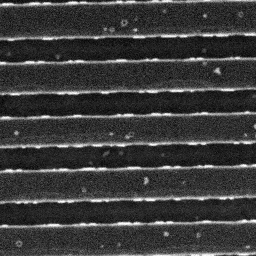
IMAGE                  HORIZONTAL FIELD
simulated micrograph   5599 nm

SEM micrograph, lines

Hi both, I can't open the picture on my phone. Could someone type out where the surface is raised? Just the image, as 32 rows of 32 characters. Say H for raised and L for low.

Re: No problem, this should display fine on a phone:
LLLLLLLLLHHHHHHHHHHHHHHHHHHHHHHH
HHHHHHHHHHHHHHHHHHHHHHHHHHHHHHHH
HHHHHHHHHHHHHHHHHHHHHHHHHHHHHHHH
HHHHHHHHHHHHHHHHHHHHHHHHHHHHHHHH
HHHHHHHHHHHHHHHHHHHLLLLLLLLLLLLL
LLLLLLLLLLLLLLLLLLLLLLLLLLLLLLLL
LLLLLLLLLLLLLLLLLLLLLLLLLLLLLLLL
LLLLLLLLLLLLLLLLLLLLLLLLHHHHHHHH
HHHHHHHHHHHHHHHHHHHHHHHHHHHHHHHH
HHHHHHHHHHHHHHHHHHHHHHHHHHHHHHHH
HHHHHHHHHHHHHHHHHHHHHHHHHHHHHHHH
HHHHHHHHHLLLLLLLLLLLLLLLLLLLLLLL
LLLLLLLLLLLLLLLLLLLLLLLLLLLLLLLL
LLLLLLLLLLLLLLLLLLLLLLLLLLLLLLLL
LLLLLLLLLLLLLLLHHHHHHHHHHHHHHHHH
HHHHHHHHHHHHHHHHHHHHHHHHHHHHHHHH
HHHHHHHHHHHHHHHHHHHHHHHHHHHHHHHH
HHHHHHHHHHHHHHHHHHHHHHHHHHHHHHHH
LLLLLLLLLLLLLLLLLLLLLLLLLLLLLLLL
LLLLLLLLLLLLLLLLLLLLLLLLLLLLLLLL
LLLLLLLLLLLLLLLLLLLLLLLLLLLLLLLL
HHHHHHHHHHHHHHHHHHHHHHHHHHHHHHHH
HHHHHHHHHHHHHHHHHHHHHHHHHHHHHHHH
HHHHHHHHHHHHHHHHHHHHHHHHHHHHHHHH
HHHHHHHHHHHHHHHHHHHHHHHHHHHHHHHH
LLLLLLLLLLLLLLLLLLLLLLLLLLLLLLLL
LLLLLLLLLLLLLLLLLLLLLLLLLLLLLLLL
LLLLLLLLLLLLLLLLLLLLLLLLLLLLLLLL
HHHHHHHHHHHHHHHHHHHHHHHHHHHHHHHH
HHHHHHHHHHHHHHHHHHHHHHHHHHHHHHHH
HHHHHHHHHHHHHHHHHHHHHHHHHHHHHHHH
HHHHHHHHHHHHHHHHHHHHHHHHHHHHHHHH